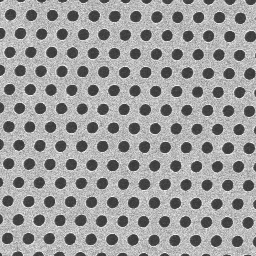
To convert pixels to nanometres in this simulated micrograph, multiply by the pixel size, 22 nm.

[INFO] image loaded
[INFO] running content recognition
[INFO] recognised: a regular array of holes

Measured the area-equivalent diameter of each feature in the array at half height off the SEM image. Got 254 nm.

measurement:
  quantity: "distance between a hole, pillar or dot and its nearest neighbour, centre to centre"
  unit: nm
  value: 456